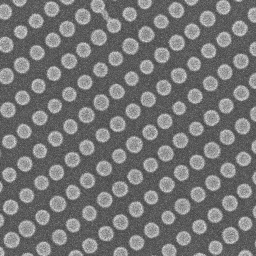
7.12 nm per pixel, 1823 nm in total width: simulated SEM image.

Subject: a regular array of raised bodies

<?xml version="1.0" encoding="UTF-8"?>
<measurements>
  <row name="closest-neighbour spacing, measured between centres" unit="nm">136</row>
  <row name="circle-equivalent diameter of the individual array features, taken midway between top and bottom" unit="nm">103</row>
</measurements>